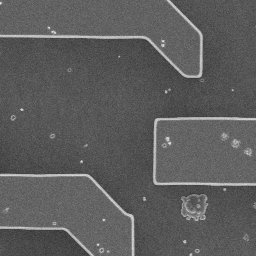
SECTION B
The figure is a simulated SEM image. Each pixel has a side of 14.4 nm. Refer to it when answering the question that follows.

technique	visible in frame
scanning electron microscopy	groups of lines, slits or small figures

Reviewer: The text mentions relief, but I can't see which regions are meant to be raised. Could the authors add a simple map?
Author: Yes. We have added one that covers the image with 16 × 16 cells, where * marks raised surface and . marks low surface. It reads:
***********.....
************....
.........****...
..........***...
...........*....
................
................
..........******
..........******
..........******
..........******
******....*.****
*******.........
********........
....****........
.....***........